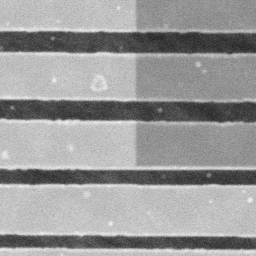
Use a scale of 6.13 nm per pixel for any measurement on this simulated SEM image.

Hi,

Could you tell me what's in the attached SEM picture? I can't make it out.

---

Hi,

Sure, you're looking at lines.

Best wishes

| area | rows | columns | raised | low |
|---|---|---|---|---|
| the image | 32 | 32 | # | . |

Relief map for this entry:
################################
################################
################################
################################
................................
................................
................................
################################
################################
################################
################################
################################
...............#.###############
................................
................................
################################
################################
################################
################################
################################
################################
................................
................................
################################
################################
################################
################################
################################
################################
...............................#
................................
################################